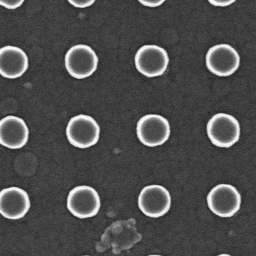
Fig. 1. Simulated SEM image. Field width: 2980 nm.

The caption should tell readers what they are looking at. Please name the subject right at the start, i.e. a regular array of raised bodies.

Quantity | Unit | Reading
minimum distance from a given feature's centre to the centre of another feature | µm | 0.813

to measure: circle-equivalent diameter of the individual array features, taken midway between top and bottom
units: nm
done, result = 360